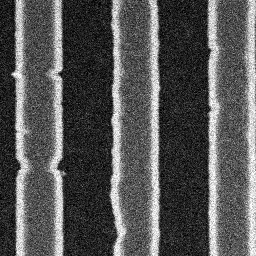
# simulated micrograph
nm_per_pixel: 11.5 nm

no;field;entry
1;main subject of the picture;one or a few lines or trenches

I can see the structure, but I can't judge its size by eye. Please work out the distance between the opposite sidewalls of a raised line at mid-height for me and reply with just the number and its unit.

459 nm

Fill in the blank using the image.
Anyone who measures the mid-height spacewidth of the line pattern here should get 661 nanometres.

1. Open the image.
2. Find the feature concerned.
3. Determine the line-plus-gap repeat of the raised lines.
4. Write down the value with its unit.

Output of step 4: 1120 nm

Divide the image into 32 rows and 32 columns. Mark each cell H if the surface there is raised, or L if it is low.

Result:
LLHHHHHLLLLLLLHHHHHLLLLLLLLHHHHH
LLHHHHHLLLLLLLHHHHHLLLLLLLHHHHHH
LLHHHHHLLLLLLLHHHHHLLLLLLLHHHHHH
LLHHHHHLLLLLLLHHHHHLLLLLLLHHHHHL
LLHHHHHLLLLLLLHHHHHLLLLLLLHHHHHL
LLHHHHHLLLLLLLHHHHHLLLLLLLLHHHHL
LLHHHHHLLLLLLLLHHHHLLLLLLLLHHHHL
LLHHHHHLLLLLLLLHHHHLLLLLLLLHHHHH
LLHHHHHLLLLLLLLHHHHLLLLLLLHHHHHH
LLHHHHHLLLLLLLLHHHHLLLLLLLHHHHHH
LLHHHHHLLLLLLLHHHHHHLLLLLLHHHHHH
LLHHHHHLLLLLLLHHHHHHLLLLLLHHHHHL
LLHHHHHLLLLLLLHHHHHLLLLLLLLHHHHL
LLHHHHHLLLLLLLLHHHHLLLLLLLLHHHHH
LLHHHHHLLLLLLLHHHHHLLLLLLLLHHHHH
LLHHHHHLLLLLLLHHHHHLLLLLLLLHHHHH
LLHHHHHLLLLLLLLHHHHLLLLLLLLHHHHL
LLLHHHHLLLLLLLHHHHHLLLLLLLLHHHHL
LLLHHHHLLLLLLLLHHHHLLLLLLLLHHHHH
LLLHHHHLLLLLLLLHHHHLLLLLLLLHHHHH
LLLHHHHLLLLLLLLHHHHLLLLLLLLHHHHH
LLLHHHHLLLLLLLLHHHHLLLLLLLLHHHHH
LLHHHHHLLLLLLLHHHHHLLLLLLLLHHHHH
LLHHHHHLLLLLLLHHHHHLLLLLLLLHHHHH
LLLHHHHLLLLLLLHHHHHHLLLLLLLHHHHH
LLLHHHHLLLLLLLHHHHHLLLLLLLLHHHHH
LLLHHHHLLLLLLLLHHHHLLLLLLLLHHHHH
LLLHHHHLLLLLLLLHHHHHLLLLLLLHHHHH
LLHHHHHLLLLLLLLHHHHHLLLLLLLHHHHH
LLLHHHHLLLLLLLLHHHHHLLLLLLLHHHHH
LLLHHHHLLLLLLLLHHHHLLLLLLLLHHHHH
LLLHHHHLLLLLLLLHHHHLLLLLLLLHHHHH